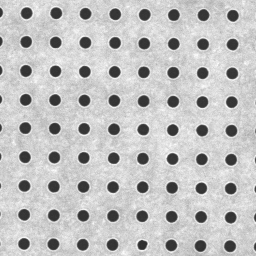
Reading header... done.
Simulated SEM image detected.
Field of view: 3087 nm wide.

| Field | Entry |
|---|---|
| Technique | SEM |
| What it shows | a regular array of holes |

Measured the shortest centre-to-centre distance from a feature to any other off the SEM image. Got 346 nm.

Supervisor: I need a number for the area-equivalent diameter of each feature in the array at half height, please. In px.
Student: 11.6